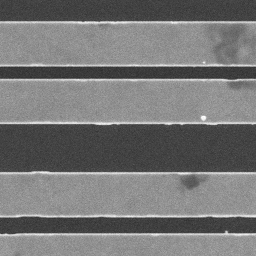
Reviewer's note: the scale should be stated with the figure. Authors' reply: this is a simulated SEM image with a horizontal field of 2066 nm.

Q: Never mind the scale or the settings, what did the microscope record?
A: lines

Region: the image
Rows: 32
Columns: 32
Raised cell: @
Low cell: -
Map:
--------------------------------
--------------------------------
--------------------------------
@@@@@@@@@@@@@@@@@@@@@@@@@@@@@@@@
@@@@@@@@@@@@@@@@@@@@@@@@@@@@@@@@
@@@@@@@@@@@@@@@@@@@@@@@@@@@@@@@@
@@@@@@@@@@@@@@@@@@@@@@@@@@@@@@@@
@@@@@@@@@@@@@@@@@@@@@@@@@@@@@@@@
--------------------------------
--------------------------------
@@@@@@@@@@@@@@@@@@@@@@@@@@@@@@@@
@@@@@@@@@@@@@@@@@@@@@@@@@@@@@@@@
@@@@@@@@@@@@@@@@@@@@@@@@@@@@@@@@
@@@@@@@@@@@@@@@@@@@@@@@@@@@@@@@@
@@@@@@@@@@@@@@@@@@@@@@@@@@@@@@@@
------------@@@------@@--@@@----
--------------------------------
--------------------------------
--------------------------------
--------------------------------
--------------------------------
----@@@-------------------------
@@@@@@@@@@@@@@@@@@@@@@@@@@@@@@@@
@@@@@@@@@@@@@@@@@@@@@@@@@@@@@@@@
@@@@@@@@@@@@@@@@@@@@@@@@@@@@@@@@
@@@@@@@@@@@@@@@@@@@@@@@@@@@@@@@@
@@@@@@@@@@@@@@@@@@@@@@@@@@@@@@@@
--------------------------------
--------------------------------
@@@@@@@@@@@@@@@@@@@@@@@@@@@@@@@@
@@@@@@@@@@@@@@@@@@@@@@@@@@@@@@@@
@@@@@@@@@@@@@@@@@@@@@@@@@@@@@@@@